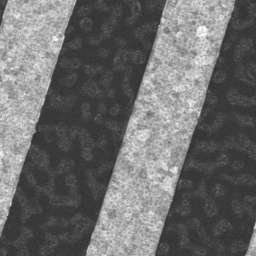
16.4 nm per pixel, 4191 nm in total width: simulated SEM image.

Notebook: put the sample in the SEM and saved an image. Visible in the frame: one or a few lines or trenches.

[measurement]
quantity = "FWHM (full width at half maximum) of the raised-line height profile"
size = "1060 nm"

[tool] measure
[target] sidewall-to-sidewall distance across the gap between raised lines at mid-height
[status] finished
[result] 1440 nm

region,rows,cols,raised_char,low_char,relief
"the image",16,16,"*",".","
*****.....*****.
****......****..
****......****..
****.....*****..
***......****...
***......****...
***.....*****...
**......****....
**......****....
**.....*****....
*......****.....
*......****.....
*.....*****.....
......****......
......****......
......****......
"